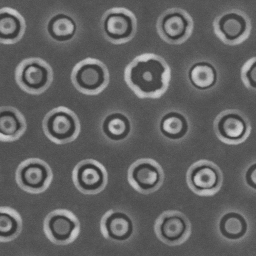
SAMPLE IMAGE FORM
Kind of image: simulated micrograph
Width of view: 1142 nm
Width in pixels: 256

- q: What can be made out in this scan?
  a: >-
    a regular array of ring-shaped grooves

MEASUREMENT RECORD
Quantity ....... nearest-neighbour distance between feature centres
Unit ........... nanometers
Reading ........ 254